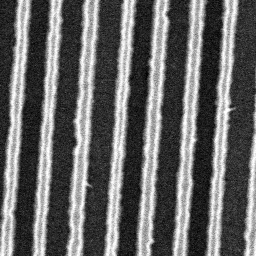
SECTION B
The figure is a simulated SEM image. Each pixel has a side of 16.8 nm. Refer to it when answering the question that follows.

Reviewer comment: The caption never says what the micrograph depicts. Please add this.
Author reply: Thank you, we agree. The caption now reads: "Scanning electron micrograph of parallel lines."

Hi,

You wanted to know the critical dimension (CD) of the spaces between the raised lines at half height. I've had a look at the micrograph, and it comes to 382 nanometres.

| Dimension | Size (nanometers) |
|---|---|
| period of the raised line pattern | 578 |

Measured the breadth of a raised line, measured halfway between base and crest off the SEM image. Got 0.185 µm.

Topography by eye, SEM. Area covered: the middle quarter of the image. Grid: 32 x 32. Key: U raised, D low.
DDDDUUUDDDDDDDUUDDDDDDUUUDDDDDDU
DDDDUUUDDDDDDDUUDDDDDDUUUDDDDDDU
DDDDUUUDDDDDDDUUDDDDDUUUUDDDDDDU
DDDDUUUDDDDDDDUUDDDDDUUUUDDDDDDU
DDDDUUUDDDDDDDUUDDDDDDUUUDDDDDDU
DDDDUUUDDDDDDDUUDDDDDDUUDDDDDDUU
DDDDUUUDDDDDDUUUDDDDDUUUDDDDDDUU
DDDDUUUDDDDDDUUUDDDDDUUUUDDDDDUU
DDDDUUUDDDDDDUUUDDDDDUUUDDDDDDUU
DDDUUUUDDDDDDUUUDDDDDUUUDDDDDDUU
DDDUUUUDDDDDDUUDDDDDDUUUDDDDDDUU
DDDUUUUDDDDDDUUDDDDDDUUUDDDDDDUU
DDDUUUDDDDDDDUUUDDDDDUUUDDDDDDUU
DDDUUUDDDDDDDUUDDDDDDUUUDDDDDDUU
DDDUUUDDDDDDDUUDDDDDDUUUDDDDDDUU
DDDUUUDDDDDDDUUDDDDDDUUUDDDDDDUU
DDDUUUDDDDDDDUUDDDDDUUUUDDDDDDUU
DDDUUUDDDDDDDUUDDDDDUUUUDDDDDDUU
DDDUUUDDDDDDDUUDDDDDUUUUDDDDDDUU
DDDUUUDDDDDDDUUDDDDDUUUDDDDDDDUU
DDDUUUDDDDDDUUUDDDDDUUUDDDDDDUUU
DDDUUUDDDDDDDUUDDDDDUUUDDDDDDUUU
DDDUUUDDDDDDUUUDDDDDUUUDDDDDDUUU
DDDUUDDDDDDDUUUDDDDDUUUDDDDDDUUU
DDDUUUDDDDDDUUDDDDDDUUUDDDDDDUUU
DDDUUUDDDDDDUUDDDDDDUUUDDDDDDUUU
DDDUUDDDDDDDUUDDDDDDUUUDDDDDDUUU
DDUUUDDDDDDDUUDDDDDDUUUDDDDDDUUU
DDUUUUDDDDDDUUDDDDDDUUUDDDDDDUUU
DDUUUDDDDDDDUUDDDDDDUUUDDDDDUUUU
DDUUUDDDDDDDUUDDDDDUUUDDDDDDUUUU
DDUUUDDDDDDUUUDDDDDDUUUDDDDDDUUU